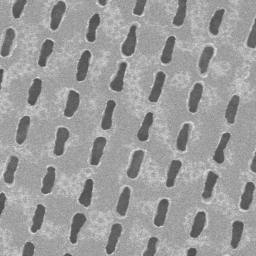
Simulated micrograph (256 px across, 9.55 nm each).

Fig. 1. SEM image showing a regular array of holes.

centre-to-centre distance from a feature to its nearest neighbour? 38.3 pixels